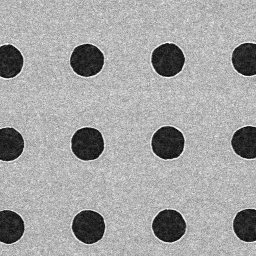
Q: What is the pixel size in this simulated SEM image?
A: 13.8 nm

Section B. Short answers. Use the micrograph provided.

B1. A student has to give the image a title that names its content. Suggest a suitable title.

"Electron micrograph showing holes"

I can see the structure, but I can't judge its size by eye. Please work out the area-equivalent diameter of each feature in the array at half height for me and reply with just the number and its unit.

470 nm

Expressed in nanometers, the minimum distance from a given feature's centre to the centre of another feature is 1110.